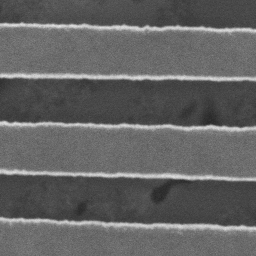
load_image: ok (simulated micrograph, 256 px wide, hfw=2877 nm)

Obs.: lines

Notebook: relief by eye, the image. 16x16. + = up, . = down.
................
+...............
++++++++++++++++
++++++++++++++++
++++++++++++++++
................
................
................
++++++++++++++++
++++++++++++++++
++++++++++++++++
................
................
................
++++++++++++++++
++++++++++++++++